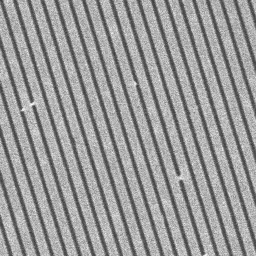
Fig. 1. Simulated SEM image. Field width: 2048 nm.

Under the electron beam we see parallel lines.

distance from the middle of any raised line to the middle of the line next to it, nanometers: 105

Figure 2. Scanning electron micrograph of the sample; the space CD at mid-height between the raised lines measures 34.4 nm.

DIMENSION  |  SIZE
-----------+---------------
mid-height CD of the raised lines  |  67.9 nm